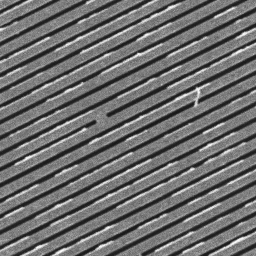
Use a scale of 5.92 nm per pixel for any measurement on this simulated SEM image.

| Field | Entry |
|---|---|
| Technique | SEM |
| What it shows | parallel lines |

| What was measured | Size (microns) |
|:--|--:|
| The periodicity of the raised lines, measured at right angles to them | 0.0831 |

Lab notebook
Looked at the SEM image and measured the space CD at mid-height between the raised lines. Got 3.7 px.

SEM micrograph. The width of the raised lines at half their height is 59.5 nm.